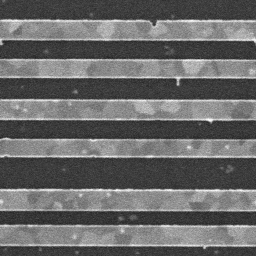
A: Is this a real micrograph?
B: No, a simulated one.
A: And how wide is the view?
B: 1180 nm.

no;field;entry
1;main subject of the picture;parallel lines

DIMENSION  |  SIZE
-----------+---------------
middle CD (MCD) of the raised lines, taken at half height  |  91.5 nanometres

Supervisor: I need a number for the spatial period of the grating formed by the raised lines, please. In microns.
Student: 0.189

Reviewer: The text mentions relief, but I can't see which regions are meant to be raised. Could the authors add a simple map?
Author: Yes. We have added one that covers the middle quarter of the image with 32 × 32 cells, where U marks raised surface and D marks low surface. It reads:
UUUUUUUUUUUUUUUUUUUUUUUUUUUUUUUU
UUUUUUUUUUUUUUUUUUUUUUUUUUUUUUUU
UUUUUUUUUUUUUUUUUUUUUUUUUUUUUUUU
DDDDDDDDDDDDDDDDDDDDDDDDDDDDUDDD
DDDDDDDDDDDDDDDDDDDDDDDDDDDDDDDD
DDDDDDDDDDDDDDDDDDDDDDDDDDDDDDDD
DDDDDDDDDDDDDDDDDDDDDDDDDDDDDDDD
DDDDDDDDDDDDDDDDDDDDDDDDDDDDDDDD
DDDDDDDDDDDDDDDDDDDDDDDDDDDDDDDD
UUUUUUUUUUUUUUUUUUUUUUUUUUUUUUUU
UUUUUUUUUUUUUUUUUUUUUUUUUUUUUUUU
UUUUUUUUUUUUUUUUUUUUUUUUUUUUUUUU
UUUUUUUUUUUUUUUUUUUUUUUUUUUUUUUU
UUUUUUUUUUUUUUUUUUUUUUUUUUUUUUUU
DDDDDDDDDDDDDDDDDDDDDDDDDDDDDDDD
DDDDDDDDDDDDDDDDDDDDDDDDDDDDDDDD
DDDDDDDDDDDDDDDDDDDDDDDDDDDDDDDD
DDDDDDDDDDDDDDDDDDDDDDDDDDDDDDDD
DDDDDDDDDDDDDDDDDDDDDDDDDDDDDDDD
UUUUUUUUUUUUUUUUUUUUUUUUUUUUUUUU
UUUUUUUUUUUUUUUUUUUUUUUUUUUUUUUU
UUUUUUUUUUUUUUUUUUUUUUUUUUUUUUUU
UUUUUUUUUUUUUUUUUUUUUUUUUUUUUUUU
DDDDDDDDDDDDDDDDDDDDDDDDDDDDDDDD
DDDDDDDDDDDDDDDDDDDDDDDDDDDDDDDD
DDDDDDDDDDDDDDDDDDDDDDDDDDDDDDDD
DDDDDDDDDDDDDDDDDDDDDDDDDDDDDDDD
DDDDDDDDDDDDDDDDDDDDDDDDDDDDDDDD
DDDDDDDDDDDDDDDDDDDDDDDDDDDDDDDD
DDDDDDDDDDDDDDDDDDDDDDDDDDDDDDDD
DDDDDDDDDDDDDDDDDDDDDDDDDDDDDDDD
DDDDDDDDDDDDDDDDDDDDDDDDDDDDDDDD